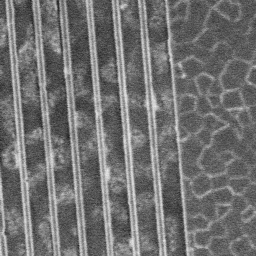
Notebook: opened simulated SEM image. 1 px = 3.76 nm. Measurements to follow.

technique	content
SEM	parallel lines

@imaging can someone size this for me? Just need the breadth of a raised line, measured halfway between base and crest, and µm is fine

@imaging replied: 0.0211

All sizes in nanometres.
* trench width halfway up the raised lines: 77.3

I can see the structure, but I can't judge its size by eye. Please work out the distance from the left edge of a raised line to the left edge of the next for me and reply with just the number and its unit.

0.0994 microns